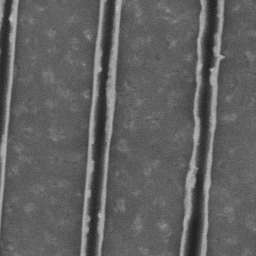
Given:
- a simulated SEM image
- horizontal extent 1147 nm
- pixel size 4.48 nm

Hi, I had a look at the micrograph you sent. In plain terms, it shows one or a few lines or trenches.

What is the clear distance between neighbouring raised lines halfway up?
374 nm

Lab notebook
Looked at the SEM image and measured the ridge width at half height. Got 87.1 nm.